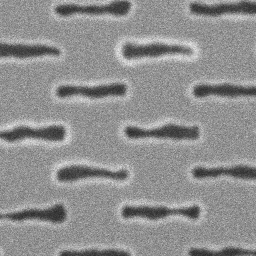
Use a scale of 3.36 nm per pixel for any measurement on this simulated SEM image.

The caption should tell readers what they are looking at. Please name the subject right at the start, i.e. holes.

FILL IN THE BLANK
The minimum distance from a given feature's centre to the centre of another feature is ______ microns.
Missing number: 0.268